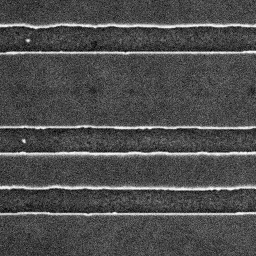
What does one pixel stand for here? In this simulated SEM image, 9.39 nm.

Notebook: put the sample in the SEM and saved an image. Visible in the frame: lines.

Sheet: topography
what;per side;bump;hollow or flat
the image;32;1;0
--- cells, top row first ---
11111111111111111111111111111111
11111111111111111111111111111111
11111111111111111111111111111111
00001000000000000000000000000000
00000000000000000000000000000000
00000000000000000000000000000000
00000100000000000000000000000011
11111111111111111111111111111111
11111111111111111111111111111111
11111111111111111111111111111111
11111111111111111111111111111111
11111111111111111111111111111111
11111111111111111111111111111111
11111111111111111111111111111111
11111111111111111111111111111111
11111111111111111111111111111111
00000000000000000000000000000000
00000000000000000000000000000000
00000000000000000000000000000000
11111111111111111111111111111111
11111111111111111111111111111111
11111111111111111111111111111111
11111111111111111111111111111111
10011100110111111111111111111101
00000000000000000000000000000000
00000000000000000000000000000000
00000000000000000000000000000000
11111111111111111111111111111111
11111111111111111111111111111111
11111111111111111111111111111111
11111111111111111111111111111111
11111111111111111111111111111111